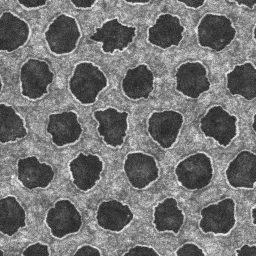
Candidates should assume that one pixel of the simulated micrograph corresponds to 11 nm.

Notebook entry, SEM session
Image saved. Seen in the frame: a regular array of holes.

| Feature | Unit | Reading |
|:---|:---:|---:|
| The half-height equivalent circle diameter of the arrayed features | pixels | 35.5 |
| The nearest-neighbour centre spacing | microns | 0.547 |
